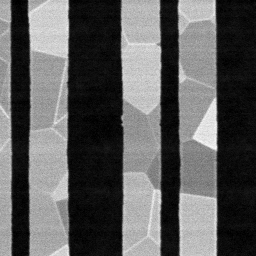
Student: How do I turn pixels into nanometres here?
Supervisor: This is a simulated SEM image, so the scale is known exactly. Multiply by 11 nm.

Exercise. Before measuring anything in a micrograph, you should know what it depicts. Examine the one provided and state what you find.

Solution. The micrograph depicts one or a few lines or trenches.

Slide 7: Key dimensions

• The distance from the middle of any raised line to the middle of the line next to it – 817 nm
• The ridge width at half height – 407 nanometres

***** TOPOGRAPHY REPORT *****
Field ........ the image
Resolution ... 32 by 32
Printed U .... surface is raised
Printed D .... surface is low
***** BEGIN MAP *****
UDDDUUUUDDDDDDDUUUUUDDDDDDDDDDDD
UDDDUUUUDDDDDDDUUUUUDDDDDDDDDDDD
UDDDUUUUDDDDDDDUUUUUDDUUDUUDDDDD
UDDDUUUUDDDDDDDUUUUUDDUUUUUDDDDD
UDDDUUUUDDDDDDDUUUUUDDUUUUUDDDDD
UDDDUUUUDDDDDDDUUUUUDDUUUUUDDDDD
UDDDDDUUDDDDDDDUUUUUDDUUUUUDDDDD
UDDDDDDDDDDDDDDUUUUUDDUUUUUDDDDD
UDDDDDDDDDDDDDDUUUUUDDUUUUUDDDDD
UDDDDDDDDDDDDDDUUUUUDDUUUUUDDDDD
DDDDDDDDDDDDDDDUUUUUDDUUUUUDDDDD
DDDDDDDDDDDDDDDUUUUUDDUUUUUDDDDD
DDDDDDDUDDDDDDDUUUUUDDUUUUUDDDDD
DDDDDDDUDDDDDDDUUUUUDDUUUUUDDDDD
UDDDDDDUDDDDDDDUUUUUDDUUUUUDDDDD
UDDDDDDUDDDDDDDUUUUUDDUUUUUDDDDD
UDDDUUUUDDDDDDDDUUUUDDUUUUUDDDDD
UDDDUUUUDDDDDDDDUUUUDDDUUUUDDDDD
UDDDUUUUDDDDDDDDUUUUDDDUUUUDDDDD
UDDDUUUUDDDDDDDUUUUUDDDUUUUDDDDD
UDDDUUUUDDDDDDDUUUUUDDDUUUUDDDDD
UDDDUUUUDDDDDDDUUUUUDDDUUUUDDDDD
UDDDUUUUDDDDDDDUUUUUDDDUUUUDDDDD
UDDDUUUUDDDDDDDUUUUUDDDUUUUDDDDD
UDDDUUUUDDDDDDDUUUUDDDDDDUUDDDDD
UDDDUUUUDDDDDDDUUUUDDDDDDDDDDDDD
UDDDUUUUDDDDDDDUUUUDDDDDDDDDDDDD
UDDDUUUUUDDDDDDUUUUDDDDDDDDDDDDD
UDDDUUUUUDDDDDDUUUUDDDDDDDDDDDDD
UDDDUUUUDDDDDDDUUUUDDDDDDDDDDDDD
UDDDUUUUDDDDDDDUUUUUDDDDDDDDDDDD
UDDDUUUUUDDDDDDUUUUUDDDDDDDDDDDD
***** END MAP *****